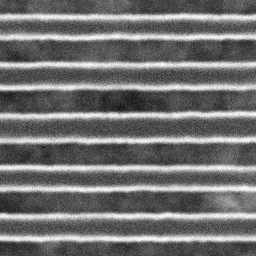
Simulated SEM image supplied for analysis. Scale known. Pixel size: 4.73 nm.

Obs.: lines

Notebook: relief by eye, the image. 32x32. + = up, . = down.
................................
................................
++++++++++++++++++++++++++++++++
++++++++++++++++++++++++++++++++
++++++++++++++++++++++++++++++++
................................
................................
................................
++++++++++++++++++++++++++++++++
++++++++++++++++++++++++++++++++
++++++++++++++++++++++++++++++++
................................
................................
................................
++.++.++++++++++++++++++++++++++
++++++++++++++++++++++++++++++++
++++++++++++++++++++++++++++++++
++++++++++++++++++++++++++++++++
................................
................................
................................
++++++++++++++++++++++++++++++++
++++++++++++++++++++++++++++++++
++++++++++++++++++++++++++++++++
................................
................................
................................
++++++++++++++++++++++++++++++++
++++++++++++++++++++++++++++++++
++++++++++++++++++++++++++++++++
................................
................................